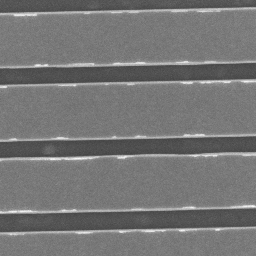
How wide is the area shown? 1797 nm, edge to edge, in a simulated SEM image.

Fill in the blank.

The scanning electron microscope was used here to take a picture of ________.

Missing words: one or a few lines or trenches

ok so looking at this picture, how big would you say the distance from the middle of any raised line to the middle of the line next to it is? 0.509 µm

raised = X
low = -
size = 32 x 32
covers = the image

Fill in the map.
--------------------------------
------------XXXXXXXXXXXXXXXXXXXX
XXXXXXXXXXXXXXXXXXXXXXXXXXXXXXXX
XXXXXXXXXXXXXXXXXXXXXXXXXXXXXXXX
XXXXXXXXXXXXXXXXXXXXXXXXXXXXXXXX
XXXXXXXXXXXXXXXXXXXXXXXXXXXXXXXX
XXXXXXXXXXXXXXXXXXXXXXXXXXXXXXXX
XXXXXXXXXXXXXXXXXXXXXXXXXXXXXXXX
--------------------------------
--------------------------------
---------XXXXXXXXXXXXXXXXXXXXXXX
XXXXXXXXXXXXXXXXXXXXXXXXXXXXXXXX
XXXXXXXXXXXXXXXXXXXXXXXXXXXXXXXX
XXXXXXXXXXXXXXXXXXXXXXXXXXXXXXXX
XXXXXXXXXXXXXXXXXXXXXXXXXXXXXXXX
XXXXXXXXXXXXXXXXXXXXXXXXXXXXXXXX
XXXXXXXXXXXXXXXXXXXXXXXXXXXXXXXX
XXXXX---------------------------
--------------------------------
-----------------XXXXXXXXXXXXXXX
XXXXXXXXXXXXXXXXXXXXXXXXXXXXXXXX
XXXXXXXXXXXXXXXXXXXXXXXXXXXXXXXX
XXXXXXXXXXXXXXXXXXXXXXXXXXXXXXXX
XXXXXXXXXXXXXXXXXXXXXXXXXXXXXXXX
XXXXXXXXXXXXXXXXXXXXXXXXXXXXXXXX
XXXXXXXXXXXXXXXXXXXXXXXXXXXXXXXX
XX--XXX-------------------------
--------------------------------
-----------------------------XXX
XXXXXXXXXXXXXXXXXXXXXXXXXXXXXXXX
XXXXXXXXXXXXXXXXXXXXXXXXXXXXXXXX
XXXXXXXXXXXXXXXXXXXXXXXXXXXXXXXX